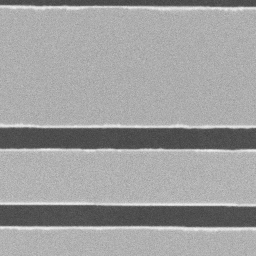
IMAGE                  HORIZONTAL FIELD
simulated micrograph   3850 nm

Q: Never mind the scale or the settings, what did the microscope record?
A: lines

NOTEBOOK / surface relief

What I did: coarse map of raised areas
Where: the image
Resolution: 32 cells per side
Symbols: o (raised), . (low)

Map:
................................
oooooooooooooooooooooooooooooooo
oooooooooooooooooooooooooooooooo
oooooooooooooooooooooooooooooooo
oooooooooooooooooooooooooooooooo
oooooooooooooooooooooooooooooooo
oooooooooooooooooooooooooooooooo
oooooooooooooooooooooooooooooooo
oooooooooooooooooooooooooooooooo
oooooooooooooooooooooooooooooooo
oooooooooooooooooooooooooooooooo
oooooooooooooooooooooooooooooooo
oooooooooooooooooooooooooooooooo
oooooooooooooooooooooooooooooooo
oooooooooooooooooooooooooooooooo
oooooooooooooooooooooooooooooooo
................................
................................
................................
oooooooooooooooooooooooooooooooo
oooooooooooooooooooooooooooooooo
oooooooooooooooooooooooooooooooo
oooooooooooooooooooooooooooooooo
oooooooooooooooooooooooooooooooo
oooooooooooooooooooooooooooooooo
oooooooooooooooooooooooooooooooo
................................
................................
oooooooooooooooooooooooooooooooo
oooooooooooooooooooooooooooooooo
oooooooooooooooooooooooooooooooo
oooooooooooooooooooooooooooooooo